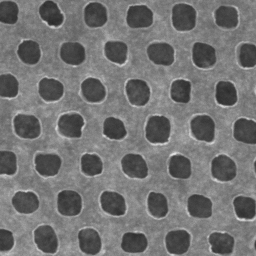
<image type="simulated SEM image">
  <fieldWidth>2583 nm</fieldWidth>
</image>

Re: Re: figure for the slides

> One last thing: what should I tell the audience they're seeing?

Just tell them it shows a regular array of holes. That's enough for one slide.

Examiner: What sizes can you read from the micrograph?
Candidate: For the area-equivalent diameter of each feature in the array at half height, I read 256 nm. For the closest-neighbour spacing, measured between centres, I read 428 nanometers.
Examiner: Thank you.